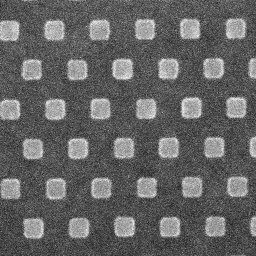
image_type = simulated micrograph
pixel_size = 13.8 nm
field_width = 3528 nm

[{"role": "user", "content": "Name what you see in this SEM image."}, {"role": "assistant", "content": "a regular array of raised bodies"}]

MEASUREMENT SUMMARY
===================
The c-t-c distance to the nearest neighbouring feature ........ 622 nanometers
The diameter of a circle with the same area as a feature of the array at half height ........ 276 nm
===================